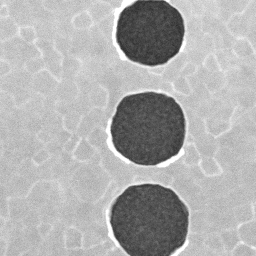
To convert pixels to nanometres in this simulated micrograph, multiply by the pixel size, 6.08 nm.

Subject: holes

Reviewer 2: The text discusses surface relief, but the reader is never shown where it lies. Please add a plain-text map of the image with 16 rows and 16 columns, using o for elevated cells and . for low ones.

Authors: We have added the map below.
oooooooo...ooooo
ooooooo....ooooo
ooooooo....ooooo
oooooooo...ooooo
oooooooooooooooo
oooooooooooooooo
ooooooo....ooooo
ooooooo.....oooo
ooooooo.....oooo
ooooooo....ooooo
oooooooooooooooo
ooooooooo.oooooo
ooooooo....ooooo
ooooooo.....oooo
ooooooo.....oooo
oooooooo...ooooo